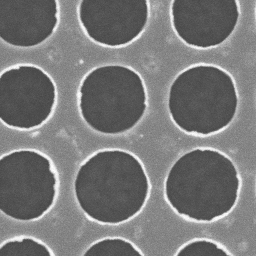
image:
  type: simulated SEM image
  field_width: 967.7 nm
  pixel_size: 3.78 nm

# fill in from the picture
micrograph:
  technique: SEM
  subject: holes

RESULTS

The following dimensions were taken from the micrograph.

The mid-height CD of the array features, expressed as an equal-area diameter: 262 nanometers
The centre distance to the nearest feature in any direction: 326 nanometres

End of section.